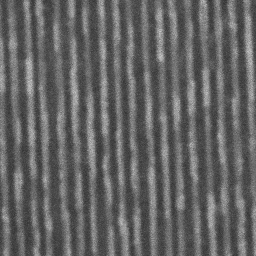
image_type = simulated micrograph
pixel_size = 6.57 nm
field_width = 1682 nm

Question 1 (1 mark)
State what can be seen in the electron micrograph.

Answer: parallel lines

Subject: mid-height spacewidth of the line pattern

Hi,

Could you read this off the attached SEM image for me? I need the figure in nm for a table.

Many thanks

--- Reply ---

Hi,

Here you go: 62.4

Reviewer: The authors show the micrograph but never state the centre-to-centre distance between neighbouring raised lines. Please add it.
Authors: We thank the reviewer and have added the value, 96.6 nm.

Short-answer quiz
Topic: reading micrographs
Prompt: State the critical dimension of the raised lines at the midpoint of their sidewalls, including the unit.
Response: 0.0345 µm